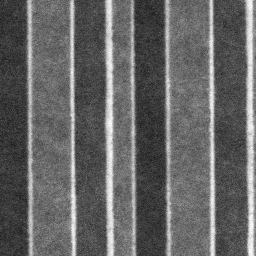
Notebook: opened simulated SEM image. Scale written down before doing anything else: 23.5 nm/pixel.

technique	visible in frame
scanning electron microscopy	lines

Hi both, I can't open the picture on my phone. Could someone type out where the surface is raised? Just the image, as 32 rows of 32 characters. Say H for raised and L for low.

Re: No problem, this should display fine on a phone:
LLLLHHHHHLLLLLHHLLLLLHHHHHLLLLLH
LLLLHHHHHLLLLLHHLLLLLHHHHHLLLLLH
LLLLHHHHHLLLLLHHLLLLLHHHHHLLLLLH
LLLLHHHHHLLLLLHHLLLLLHHHHHLLLLLH
LLLLHHHHHLLLLLHHLLLLLHHHHHLLLLLH
LLLLHHHHHLLLLLHHLLLLLHHHHHLLLLLH
LLLLHHHHHLLLLLHHLLLLLHHHHHLLLLLH
LLLLHHHHHLLLLLHHLLLLLHHHHHLLLLLH
LLLLHHHHHLLLLLHHHLLLLHHHHHLLLLLH
LLLLHHHHHLLLLLHHLLLLLHHHHHLLLLLH
LLLLHHHHHLLLLLHHHLLLLHHHHHLLLLLH
LLLLHHHHHLLLLLHHHLLLLHHHHHLLLLLH
LLLLHHHHHLLLLLHHHLLLLHHHHHLLLLLH
LLLLHHHHHLLLLLHHHLLLLHHHHHLLLLLH
LLLLHHHHHLLLLLHHHLLLLHHHHHLLLLLH
LLLLHHHHHLLLLLHHHLLLLHHHHHLLLLLH
LLLLHHHHHLLLLLHHHLLLLHHHHHLLLLLH
LLLLHHHHHLLLLLHHHLLLLHHHHHLLLLLH
LLLLHHHHHLLLLLHHHLLLLHHHHHLLLLLH
LLLLHHHHHLLLLLHHHLLLLHHHHHLLLLLH
LLLLHHHHHLLLLLHHHLLLLHHHHHLLLLLH
LLLLHHHHHLLLLLHHHLLLLHHHHHLLLLLH
LLLLHHHHHLLLLLHHHLLLLHHHHHLLLLLH
LLLLHHHHHLLLLLHHHLLLLHHHHHLLLLLH
LLLLHHHHHLLLLLHHHLLLLHHHHHLLLLLH
LLLLHHHHHLLLLLHHHLLLLHHHHHLLLLLH
LLLLHHHHHLLLLLHHHLLLLHHHHHLLLLLH
LLLLHHHHHLLLLLHHHLLLLHHHHHLLLLLH
LLLLHHHHHLLLLLHHHLLLLHHHHHHLLLLH
LLLLHHHHHLLLLLHHHLLLLHHHHHHLLLLH
LLLLHHHHHLLLLLHHHLLLLHHHHHHLLLLH
LLLLHHHHHLLLLLHHHLLLLHHHHHHLLLLH